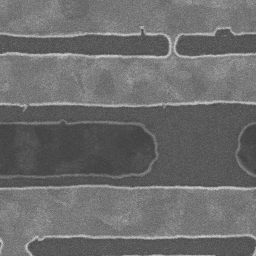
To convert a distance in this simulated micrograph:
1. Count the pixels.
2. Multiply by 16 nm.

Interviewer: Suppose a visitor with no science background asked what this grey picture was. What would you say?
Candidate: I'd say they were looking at one or a few lines or trenches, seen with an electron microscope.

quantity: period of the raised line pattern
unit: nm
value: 1070